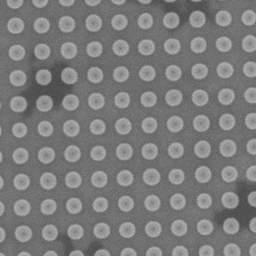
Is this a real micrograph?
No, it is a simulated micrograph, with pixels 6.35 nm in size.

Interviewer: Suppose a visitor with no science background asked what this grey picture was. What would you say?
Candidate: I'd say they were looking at an array of small figures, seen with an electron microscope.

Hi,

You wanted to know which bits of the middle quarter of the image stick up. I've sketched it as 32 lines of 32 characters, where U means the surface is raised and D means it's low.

DDDDDDDDDDDDDDDDDDDDDDDDDDDUDDDD
UUDDDDUUUDDDDUUUDDDUUUUDDDUUUDDD
UUUDDDUUUUDDUUUUDDDUUUUDDUUUUDDD
UUUDDDUUUUDDDUUUDDDUUUDDDDUUUDDD
UUUDDDDUUDDDDDDDDDDDDDDDDDDDDDDD
DDDDDDDDDDDDDDDDDDDDDDDDDDDDDDDD
DDDDDDDDDDDDDDDDDDDDDDDDDDDDDDDD
DDDDDDDUUDDDDDUUDDDDUUDDDDUUUDDD
UUUDDDUUUUDDDUUUDDDUUUUDDUUUUDDD
UUUUDDUUUUDDDUUUDDDUUUUDDDUUUDDD
UUUDDDDUUUDDDUUUDDDDUUDDDDDDDDDD
DDDDDDDDDDDDDDDDDDDDDDDDDDDDDDDD
DDDDDDDDDDDDDDDDDDDDDDDDDDDDDDDD
DDDDDDDDDDDDDDDDDDDDDDDDDDDUUDDD
DUUDDDDUUUDDDUUUDDDDUUUDDDUUUUDD
UUUUDDDUUUDDDUUUUDDDUUUDDDUUUUDD
UUUUDDDUUUDDDUUUUDDDUUUDDDUUUDDD
UUUDDDDDDDDDDDDDDDDDDDDDDDDDDDDD
DDDDDDDDDDDDDDDDDDDDDDDDDDDDDDDD
DDDDDDDDDDDDDDDDDDDDDDDDDDDDDDDD
DDDDDDDDDDDDDDUUUDDDUUUDDDUUUDDD
UUUUDDDUUUDDDUUUUDDDUUUDDDUUUUDD
UUUUDDDUUUDDDUUUUDDDUUUDDDUUUUDD
UUUUDDDUUUDDDDUUDDDDUUUDDDDDDDDD
DDDDDDDDDDDDDDDDDDDDDDDDDDDDDDDD
DDDDDDDDDDDDDDDDDDDDDDDDDDDDDDDD
DDDDDDDDDDDDDDDDDDDDDUUDDDDUUDDD
DUUDDDDUUUDDDDUUUDDDUUUUDDUUUUDD
UUUUDDDUUUUDDUUUUDDDUUUUDDUUUUDD
UUUUDDDUUUUDDUUUUDDDUUUUDDDUUDDD
DUUUDDDDUUDDDDDDDDDDDDDDDDDDDDDD
DDDDDDDDDDDDDDDDDDDDDDDDDDDDDDDD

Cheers